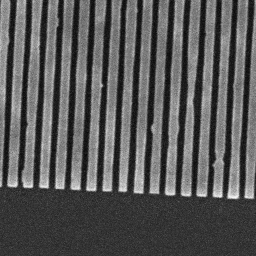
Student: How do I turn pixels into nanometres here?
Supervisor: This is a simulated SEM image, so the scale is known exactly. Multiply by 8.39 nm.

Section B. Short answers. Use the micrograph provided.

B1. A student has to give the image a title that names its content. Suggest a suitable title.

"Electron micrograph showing parallel lines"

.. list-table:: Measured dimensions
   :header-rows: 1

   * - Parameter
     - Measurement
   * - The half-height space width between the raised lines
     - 0.0587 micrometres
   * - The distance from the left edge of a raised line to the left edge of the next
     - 132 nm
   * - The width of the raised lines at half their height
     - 67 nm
